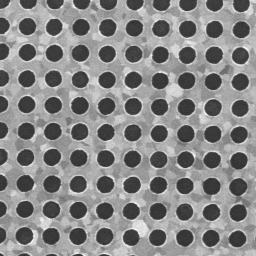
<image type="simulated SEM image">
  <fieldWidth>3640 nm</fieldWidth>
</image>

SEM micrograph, a regular array of holes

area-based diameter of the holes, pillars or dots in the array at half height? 255 nanometers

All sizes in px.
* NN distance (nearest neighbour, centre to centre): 25.9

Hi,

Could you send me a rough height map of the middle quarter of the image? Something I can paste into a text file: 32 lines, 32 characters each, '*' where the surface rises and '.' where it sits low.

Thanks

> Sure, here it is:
********************************
********************************
**....***...****...****...***...
**....***....**.....**....***...
**....***....**....***....**....
***...***....**....***....***...
******************************.*
********************************
***..*****..*****.**************
**....***....**....***....***...
**....**.....**.....**....**....
**....**.....**....***....**....
***..****...****...***...****...
********************************
********************************
**....***...****...****..****...
**....**.....**....***....**....
**....**.....**.....*.....**....
**....***...***....***....**....
***********************..****..*
********************************
***..*****.******.**************
**....**....***....***....***...
*.....**.....**....**.....**....
**....**.....**....**.....**....
***..****...****..****...****...
********************************
********************************
**...****...****..****...*****.*
*.....**.....**....***....**....
*.....**.....**....**.....**....
**...***....***....**.....**....